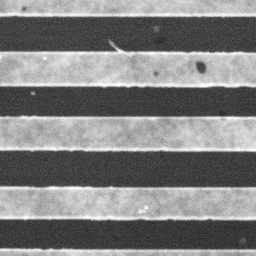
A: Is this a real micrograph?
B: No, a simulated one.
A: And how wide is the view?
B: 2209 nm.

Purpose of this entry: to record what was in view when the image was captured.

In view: lines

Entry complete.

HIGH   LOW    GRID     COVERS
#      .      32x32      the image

################################
################################
................................
................................
................................
................................
..............##................
################################
################################
################################
################################
................................
................................
................................
................................
################################
################################
################################
################################
................................
................................
................................
................................
#####.######.#..................
################################
################################
################################
................................
................................
................................
................................
################################